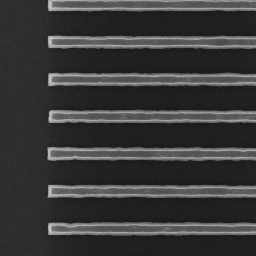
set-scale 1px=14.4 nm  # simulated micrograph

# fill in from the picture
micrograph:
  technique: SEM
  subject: parallel lines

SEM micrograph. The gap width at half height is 0.388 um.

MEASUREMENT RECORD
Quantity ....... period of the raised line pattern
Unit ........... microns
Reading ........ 0.54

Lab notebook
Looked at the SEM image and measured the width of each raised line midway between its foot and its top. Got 152 nm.